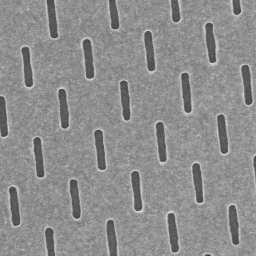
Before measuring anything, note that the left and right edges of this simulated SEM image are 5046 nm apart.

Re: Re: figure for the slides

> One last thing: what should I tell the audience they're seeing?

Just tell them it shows a regular array of holes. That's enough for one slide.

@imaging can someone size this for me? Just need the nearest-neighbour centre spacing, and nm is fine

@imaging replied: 1090